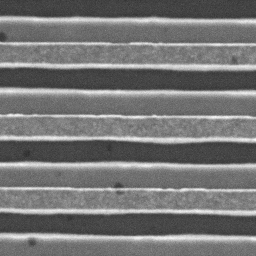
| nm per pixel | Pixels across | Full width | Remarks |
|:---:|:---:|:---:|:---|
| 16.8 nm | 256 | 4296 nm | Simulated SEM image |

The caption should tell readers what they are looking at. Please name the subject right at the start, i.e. lines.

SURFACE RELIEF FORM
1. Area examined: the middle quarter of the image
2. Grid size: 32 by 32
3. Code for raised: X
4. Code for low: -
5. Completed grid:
---------------------------XXXX-
--------------------------------
--------------------------------
--------------------------------
--------------------------------
--------------------------------
--------------------------------
XXXXXXXXXXXXXXXXXXXXXXXXXXXXXXXX
XXXXXXXXXXXXXXXXXXXXXXXXXXXXXXXX
XXXXXXXXXXXXXXXXXXXXXXXXXXXXXXXX
XXXXXXXXXXXXXXXXXXXXXXXXXXXXXXXX
XXXXXXXXXXXXXXXXXXXXXXXXXXXXXXXX
XXXXXXXXXXXXXXXXXXXXXXXXXXXXXXXX
XXXXXXXXXXXXXXXXXXXXXXXXXXXXXXXX
XXXXXXXXXXXXXXXXXXXXXXXXXXXXXXXX
XXXXXXXXXXXXXXXXXXXXXXXXXXXXXXXX
XXXXXXXXXXXXXXXXXXXXXXXXXXXXXXXX
XXXXXXXXXXXXXXXXXXXXXXXXXXXXXXXX
XXXXXXXXXXXXXXXXXXXXXXXXXXXXXXXX
--------------------------------
--------------------------------
--------------------------------
--------------------------------
--------------------------------
--------------------------------
XXXXXXXXXXXXXXXXXXXXXXXXXXX-----
XXXXXXXXXXXXXXXXXXXXXXXXXXXXXXXX
XXXXXXXXXXXXXXXXXXXXXXXXXXXXXXXX
XXXXXXXXXXXXXXXXXXXXXXXXXXXXXXXX
XXXXXXXXXXXXXXXXXXXXXXXXXXXXXXXX
XXXXXXXXXXXXXXXXXXXXXXXXXXXXXXXX
XXXXXXXXXXXXXXXXXXXXXXXXXXXXXXXX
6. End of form